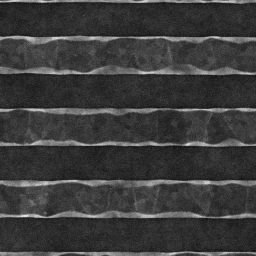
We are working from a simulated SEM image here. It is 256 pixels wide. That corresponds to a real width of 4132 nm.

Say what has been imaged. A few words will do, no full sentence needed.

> wiring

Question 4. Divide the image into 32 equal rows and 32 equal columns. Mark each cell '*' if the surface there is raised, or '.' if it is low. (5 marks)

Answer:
................................
................................
................................
................................
................................
********************************
********************************
********************************
********************************
................................
................................
................................
................................
................................
********************************
********************************
********************************
********************************
................................
................................
................................
................................
................................
********************************
********************************
********************************
********************************
................................
................................
................................
................................
................................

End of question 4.